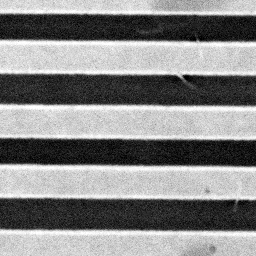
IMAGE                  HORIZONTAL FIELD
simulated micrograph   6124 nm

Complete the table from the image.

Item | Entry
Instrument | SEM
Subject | lines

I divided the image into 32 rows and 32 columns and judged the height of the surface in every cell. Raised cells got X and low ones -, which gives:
XXXXXXXXXXXXXXXXXXXXXXXXXXXXXXXX
XXXXXXXXXXXXXXXXXXXXXXXXXXXXXXXX
--------------------------------
--------------------------------
--------------------------------
XXXXXXXXXXXXXXXXXXXXXXXXXXXXXXXX
XXXXXXXXXXXXXXXXXXXXXXXXXXXXXXXX
XXXXXXXXXXXXXXXXXXXXXXXXXXXXXXXX
XXXXXXXXXXXXXXXXXXXXXXXXXXXXXXXX
----------------------X---------
--------------------------------
--------------------------------
--------------------------------
XXXXXXXXXXXXXXXXXXXXXXXXXXXXXXXX
XXXXXXXXXXXXXXXXXXXXXXXXXXXXXXXX
XXXXXXXXXXXXXXXXXXXXXXXXXXXXXXXX
XXXXXXXXXXXXXXXXXXXXXXXXXXXXXXXX
--------------------------------
--------------------------------
--------------------------------
--------------------------------
XXXXXXXXXXXXXXXXXXXXXXXXXXXXXXXX
XXXXXXXXXXXXXXXXXXXXXXXXXXXXXXXX
XXXXXXXXXXXXXXXXXXXXXXXXXXXXXXXX
XXXXXXXXXXXXXXXXXXXXXXXXXXXXXXXX
--------------------------------
--------------------------------
--------------------------------
--------------------------------
XXXXXXXXXXXXXXXXXXXXXXXXXXXXXXXX
XXXXXXXXXXXXXXXXXXXXXXXXXXXXXXXX
XXXXXXXXXXXXXXXXXXXXXXXXXXXXXXXX